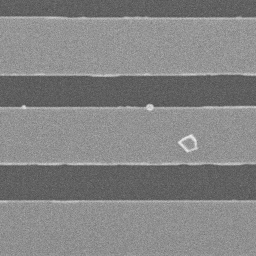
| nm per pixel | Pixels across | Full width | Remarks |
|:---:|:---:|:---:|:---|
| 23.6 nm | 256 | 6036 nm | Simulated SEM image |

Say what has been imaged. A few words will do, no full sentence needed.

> lines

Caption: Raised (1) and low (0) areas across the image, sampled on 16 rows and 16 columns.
0000000000000000
1111111111111111
1111111111111111
1111111111111111
1111111111111111
0000000000000000
0000000000000000
1111111111111111
1111111111111111
1111111111111111
0000000000000000
0000000000000000
0000000000000000
1111111111111111
1111111111111111
1111111111111111